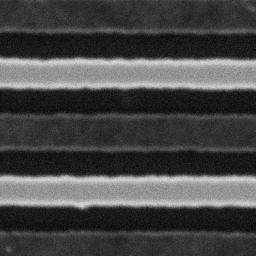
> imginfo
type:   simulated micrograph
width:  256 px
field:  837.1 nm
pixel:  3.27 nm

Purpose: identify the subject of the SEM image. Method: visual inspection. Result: lines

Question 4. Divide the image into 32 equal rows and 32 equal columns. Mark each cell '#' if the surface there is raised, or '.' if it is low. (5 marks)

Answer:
################################
################################
################################
################################
................................
................................
................................
#####.##################.#####..
################################
################################
################################
................................
................................
................................
####.#####..############...####.
################################
################################
################################
#.##############################
................................
................................
................................
################################
################################
################################
################################
................................
................................
................................
################################
################################
################################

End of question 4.